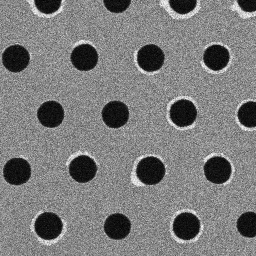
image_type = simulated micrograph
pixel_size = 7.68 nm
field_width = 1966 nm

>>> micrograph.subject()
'a regular array of holes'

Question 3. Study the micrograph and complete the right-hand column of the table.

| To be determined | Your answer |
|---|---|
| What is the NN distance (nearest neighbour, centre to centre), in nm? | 494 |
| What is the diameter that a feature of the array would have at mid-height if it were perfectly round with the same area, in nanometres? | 206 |